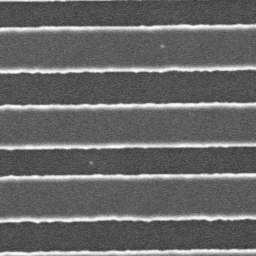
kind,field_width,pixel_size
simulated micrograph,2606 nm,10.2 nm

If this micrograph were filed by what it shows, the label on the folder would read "lines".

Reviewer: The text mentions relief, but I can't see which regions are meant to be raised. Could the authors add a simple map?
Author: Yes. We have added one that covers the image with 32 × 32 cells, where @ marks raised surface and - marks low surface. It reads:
--------------------------------
--------------------------------
--------------------------------
-----@@@@@@@@@@@@@@@@@@@@@@@@@@@
@@@@@@@@@@@@@@@@@@@@@@@@@@@@@@@@
@@@@@@@@@@@@@@@@@@@@@@@@@@@@@@@@
@@@@@@@@@@@@@@@@@@@@@@@@@@@@@@@@
@@@@@@@@@@@@@@@@@@@@@@@@@@@@@@@@
@@@@@@@@@@@@@@@@@@@@@@@@@@@@@@@@
--------------------------------
--------------------------------
--------------------------------
--------------------------------
@@@@@@@@@@@@@@@@@@@@@@@@@@@@@@@@
@@@@@@@@@@@@@@@@@@@@@@@@@@@@@@@@
@@@@@@@@@@@@@@@@@@@@@@@@@@@@@@@@
@@@@@@@@@@@@@@@@@@@@@@@@@@@@@@@@
@@@@@@@@@@@@@@@@@@@@@@@@@@@@@@@@
@@@@@@----@---------------------
--------------------------------
--------------------------------
--------------------------------
@@@@@@@@@@@@@@@@@@@@@@@@@@@@@@@@
@@@@@@@@@@@@@@@@@@@@@@@@@@@@@@@@
@@@@@@@@@@@@@@@@@@@@@@@@@@@@@@@@
@@@@@@@@@@@@@@@@@@@@@@@@@@@@@@@@
@@@@@@@@@@@@@@@@@@@@@@@@@@@@@@@@
@@@@@@@@@@@@------@-------------
--------------------------------
--------------------------------
--------------------------------
-------@-@@@-@@@@@@@@@@@@@@@@@@@